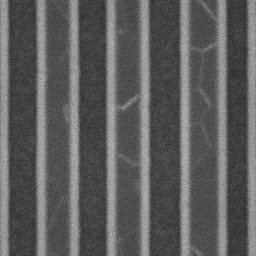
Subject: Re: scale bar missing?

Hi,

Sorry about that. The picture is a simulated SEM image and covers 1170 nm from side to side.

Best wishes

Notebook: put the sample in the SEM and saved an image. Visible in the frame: one or a few lines or trenches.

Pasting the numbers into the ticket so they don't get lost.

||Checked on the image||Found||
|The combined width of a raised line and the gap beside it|334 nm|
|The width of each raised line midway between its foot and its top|35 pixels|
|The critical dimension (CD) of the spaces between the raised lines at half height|0.164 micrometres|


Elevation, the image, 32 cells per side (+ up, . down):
.....++++.....++++.....+++++....
.....++++.....++++.....+++++....
.....++++.....++++.....+++++....
.....++++.....++++.....+++++....
+....++++.....++++.....+++++....
+....++++.....++++.....+++++....
+....++++.....++++.....+++++....
+....++++.....++++.....+++++....
+....++++.....++++.....+++++....
+....++++.....++++.....+++++....
+....++++.....++++.....+++++....
+....++++.....++++.....+++++....
+....++++.....++++.....+++++....
+....++++.....++++.....+++++....
+....++++.....++++.....+++++....
+....++++.....++++.....+++++....
+....++++.....++++.....+++++....
+....++++.....++++.....+++++....
+....++++.....++++.....+++++...+
+....++++.....++++.....+++++...+
+....++++.....++++.....+++++...+
+....++++.....++++.....+++++...+
+....++++.....++++.....+++++....
+....++++.....++++.....+++++....
+....++++.....++++.....+++++....
+....++++.....++++.....+++++....
+....++++.....++++.....+++++...+
+....++++.....++++.....+++++...+
+....++++.....++++.....+++++....
+....++++.....++++.....+++++....
+....++++.....++++.....+++++....
+....++++.....++++.....+++++....